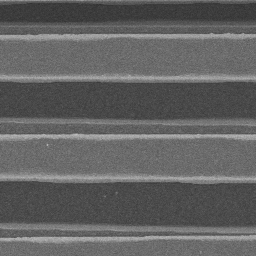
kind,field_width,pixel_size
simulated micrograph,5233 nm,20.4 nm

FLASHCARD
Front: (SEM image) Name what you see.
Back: lines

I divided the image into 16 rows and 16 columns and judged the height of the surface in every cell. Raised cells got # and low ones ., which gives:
................
................
################
################
################
................
................
................
################
################
################
................
................
................
###############.
################